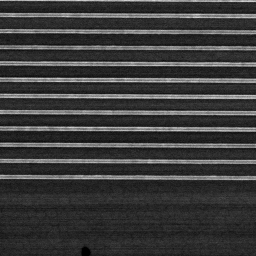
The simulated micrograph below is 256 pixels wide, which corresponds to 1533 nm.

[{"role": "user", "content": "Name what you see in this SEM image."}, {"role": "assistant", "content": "parallel lines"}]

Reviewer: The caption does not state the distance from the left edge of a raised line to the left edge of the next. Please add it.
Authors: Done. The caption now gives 97.1 nm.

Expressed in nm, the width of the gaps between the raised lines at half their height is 77.1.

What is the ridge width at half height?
20.2 nm